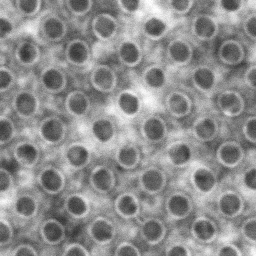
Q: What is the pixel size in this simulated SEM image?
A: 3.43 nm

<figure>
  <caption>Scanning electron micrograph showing a regular array of raised bodies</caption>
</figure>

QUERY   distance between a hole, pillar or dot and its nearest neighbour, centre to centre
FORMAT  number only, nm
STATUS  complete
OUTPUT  121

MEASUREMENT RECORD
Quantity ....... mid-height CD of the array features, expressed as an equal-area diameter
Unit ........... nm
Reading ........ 83.1